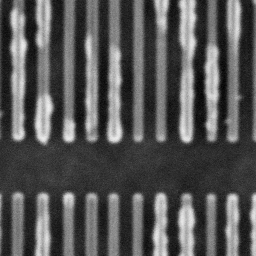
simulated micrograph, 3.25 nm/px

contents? parallel lines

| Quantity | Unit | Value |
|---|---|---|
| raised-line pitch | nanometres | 77.6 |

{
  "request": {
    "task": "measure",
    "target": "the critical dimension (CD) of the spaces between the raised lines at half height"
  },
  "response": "0.0471 microns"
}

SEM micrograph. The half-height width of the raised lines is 0.0305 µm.